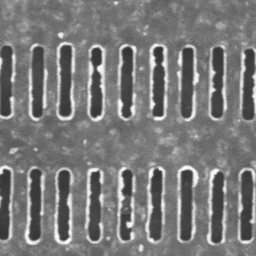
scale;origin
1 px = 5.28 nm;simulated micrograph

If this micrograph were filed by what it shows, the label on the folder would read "a regular array of holes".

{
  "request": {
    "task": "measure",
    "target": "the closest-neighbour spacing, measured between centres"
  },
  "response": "155 nanometers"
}